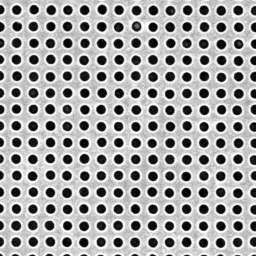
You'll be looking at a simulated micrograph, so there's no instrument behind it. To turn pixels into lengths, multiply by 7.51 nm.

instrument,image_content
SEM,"a regular array of holes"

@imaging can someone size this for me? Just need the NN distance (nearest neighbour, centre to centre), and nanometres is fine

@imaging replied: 122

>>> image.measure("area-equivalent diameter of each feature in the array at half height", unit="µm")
0.0808